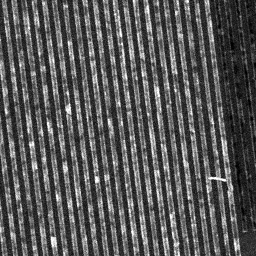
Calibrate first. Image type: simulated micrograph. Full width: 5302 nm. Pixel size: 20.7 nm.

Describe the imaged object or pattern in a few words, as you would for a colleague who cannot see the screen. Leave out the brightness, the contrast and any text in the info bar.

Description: parallel lines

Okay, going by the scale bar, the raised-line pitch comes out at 208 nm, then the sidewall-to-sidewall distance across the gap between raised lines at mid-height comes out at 126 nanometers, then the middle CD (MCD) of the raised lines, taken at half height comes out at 0.0797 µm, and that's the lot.